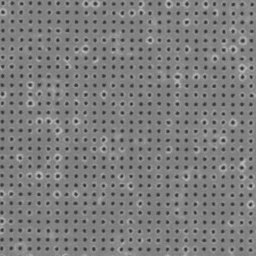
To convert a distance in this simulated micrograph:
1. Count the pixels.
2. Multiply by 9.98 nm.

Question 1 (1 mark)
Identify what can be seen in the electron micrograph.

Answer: a regular array of holes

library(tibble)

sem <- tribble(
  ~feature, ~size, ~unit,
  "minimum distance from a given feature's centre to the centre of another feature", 8.58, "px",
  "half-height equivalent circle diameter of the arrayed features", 42.2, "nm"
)